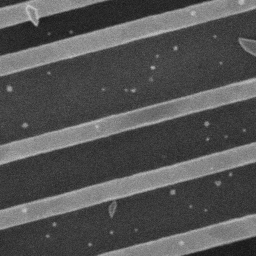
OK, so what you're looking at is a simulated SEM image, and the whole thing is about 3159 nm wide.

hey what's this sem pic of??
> lines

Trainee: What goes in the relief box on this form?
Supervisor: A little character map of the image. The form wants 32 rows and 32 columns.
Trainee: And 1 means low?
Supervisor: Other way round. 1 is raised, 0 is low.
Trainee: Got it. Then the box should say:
00111111111000000000000001111111
11111111000000000000011111111100
11111000000000000111111111100000
00000000000001111111111000000000
00000000001111111110000000000000
00000011111111100000000000000000
00111111111000000000000000000000
11111110000000000000000000000000
11110000000000000000000000000000
00000000000000000000000000000000
00000000000000000000000000000111
00000000000000000000000001111111
00000000000000000000001111111110
00000000000000000011111111100000
00000000000000111111111000000000
00000000001111111110000000000000
00000011111111100000000000000000
00011111111100000000000000000000
11111111000000000000000000000111
11110000000000000000000000111111
00000000000000000000001111111110
00000000000000000011111111100000
00000000000000111111111000000000
00000000000111111110000000000000
00000001111111110000000000000000
00011111111100000000000000000000
11111111000000000000000000000000
11111000000000000000000000000111
10000000000000000000000001111111
00000000000000000000001111111111
00000000000000000011111111110000
00000000000000111111111100000000